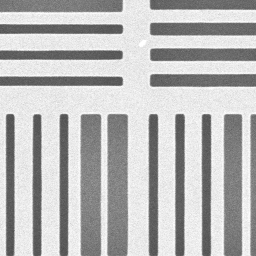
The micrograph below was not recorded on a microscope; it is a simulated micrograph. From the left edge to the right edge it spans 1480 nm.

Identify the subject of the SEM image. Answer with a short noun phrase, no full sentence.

groups of lines, slits or small figures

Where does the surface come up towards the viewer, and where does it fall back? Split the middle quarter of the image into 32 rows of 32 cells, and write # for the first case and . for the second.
################################
################################
######################..........
...............######...........
...............######...........
..............########..........
################################
################################
################################
################################
################################
################################
#####....##....#######.#####..##
.###......#.....#####...####..##
.###......#.....#####...####..##
.###......#.....#####...####..##
.###......#.....#####...####..##
.###......#.....#####...####..##
.###......#.....#####...####..##
.###......#.....#####...####..##
.###......#.....#####...####..##
.###......#.....#####...####..##
.###......#.....#####...####..##
.###......#.....#####...####..##
.###......#.....#####...####..##
.###......#.....#####...####..##
.###......#.....#####...####..##
.###......#.....#####...####..##
.###......#.....#####...####..##
.###......#.....#####...####..##
.###......#.....#####...####..##
.###......#.....#####...####..##